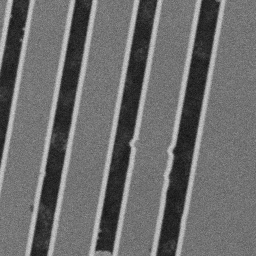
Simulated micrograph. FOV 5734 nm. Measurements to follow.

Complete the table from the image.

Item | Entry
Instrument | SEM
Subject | one or a few lines or trenches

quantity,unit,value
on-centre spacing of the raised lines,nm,1400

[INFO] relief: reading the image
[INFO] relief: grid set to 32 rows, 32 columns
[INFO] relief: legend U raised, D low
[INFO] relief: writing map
UDDDUUUUUDDDUUUUUDDDUUUUUDDDUUUU
UDDDUUUUUDDDUUUUUDDDUUUUUDDDUUUU
UDDDUUUUUDDUUUUUUDDDUUUUDDDUUUUU
UDDUUUUUDDDUUUUUDDDUUUUUDDDUUUUU
DDDUUUUUDDDUUUUUDDDUUUUUDDDUUUUU
DDDUUUUUDDDUUUUUDDDUUUUUDDDUUUUU
DDDUUUUUDDDUUUUUDDDUUUUUDDDUUUUU
DDDUUUUUDDDUUUUUDDDUUUUUDDDUUUUU
DDDUUUUUDDUUUUUUDDUUUUUDDDUUUUUU
DDUUUUUDDDUUUUUDDDUUUUUDDDUUUUUU
DDUUUUUDDDUUUUUDDDUUUUUDDDUUUUUU
DDUUUUUDDDUUUUUDDDUUUUUDDDUUUUUU
DDUUUUUDDDUUUUUDDDUUUUUDDDUUUUUU
DDUUUUUDDDUUUUUDDDUUUUDDDUUUUUUU
DUUUUUDDDUUUUUDDDUUUUUDDDUUUUUUU
DUUUUUDDDUUUUUDDDUUUUUDDDUUUUUUU
DUUUUUDDDUUUUUDDDUUUUUDDDUUUUUUU
DUUUUUDDDUUUUUDDDUUUUUDDDUUUUUUU
DUUUUUDDDUUUUUDDDUUUUDDDDUUUUUUU
DUUUUUDDUUUUUUDDDUUUUDDDUUUUUUUU
UUUUUDDDUUUUUDDDUUUUUDDDUUUUUUUU
UUUUUDDDUUUUUDDDUUUUUDDDUUUUUUUU
UUUUUDDDUUUUUDDDUUUUUDDDUUUUUUUU
UUUUUDDDUUUUUDDDUUUUUDDDUUUUUUUU
UUUUUDDDUUUUUDDDUUUUDDDDUUUUUUUU
UUUUUDDUUUUUUDDUUUUUDDDUUUUUUUUU
UUUUDDDUUUUUDDDUUUUUDDDUUUUUUUUU
UUUUDDDUUUUUDDDUUUUUDDDUUUUUUUUU
UUUUDDDUUUUUDDDUUUUUDDDUUUUUUUUU
UUUUDDDUUUUUDDDUUUUUDDDUUUUUUUUU
UUUUDDDUUUUUDDDUUUUDDDUUUUUUUUUU
UUUUDDUUUUUDDDUUUUUDDDUUUUUUUUUU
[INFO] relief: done